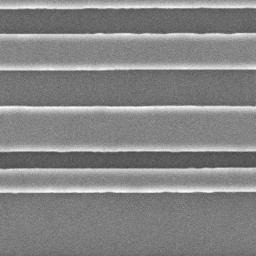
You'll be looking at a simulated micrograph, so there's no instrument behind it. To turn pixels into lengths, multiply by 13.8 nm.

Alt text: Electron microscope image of lines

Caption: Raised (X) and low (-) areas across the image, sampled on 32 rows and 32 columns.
XXXXXXXXXXXXXXXXXXXXXXXXXXXXXXXX
--------------------------------
--------------------------------
--------------------------------
XXXXXXXXXXXXXXXXXXXXXXXXXXXXXXXX
XXXXXXXXXXXXXXXXXXXXXXXXXXXXXXXX
XXXXXXXXXXXXXXXXXXXXXXXXXXXXXXXX
XXXXXXXXXXXXXXXXXXXXXXXXXXXXXXXX
XXXXXXXXXXXXXXXXXXXXXXXXXXXXXXXX
--------------------------------
--------------------------------
--------------------------------
--------------------------------
XXXX--XXXXXXXXXXXXXXXXXXXXXXXXXX
XXXXXXXXXXXXXXXXXXXXXXXXXXXXXXXX
XXXXXXXXXXXXXXXXXXXXXXXXXXXXXXXX
XXXXXXXXXXXXXXXXXXXXXXXXXXXXXXXX
XXXXXXXXXXXXXXXXXXXXXXXXXXXXXXXX
XXXXXXXXXXXXXXXXXXXXXXXXXXXXXXXX
--------------------------------
--------------------------------
XXXXXXXXXXXXXXXXXXXXXXXXXXXXXXXX
XXXXXXXXXXXXXXXXXXXXXXXXXXXXXXXX
XXXXXXXXXXXXXXXXXXXXXXXXXXXXXXXX
--------------------------------
--------------------------------
--------------------------------
--------------------------------
--------------------------------
--------------------------------
--------------------------------
--------------------------------